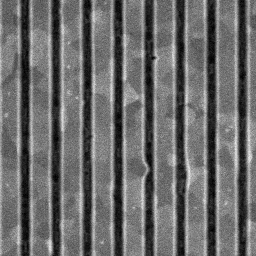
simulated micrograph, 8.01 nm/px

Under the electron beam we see parallel lines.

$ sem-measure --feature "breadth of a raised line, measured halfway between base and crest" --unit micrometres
0.167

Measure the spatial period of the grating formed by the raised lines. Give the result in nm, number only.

249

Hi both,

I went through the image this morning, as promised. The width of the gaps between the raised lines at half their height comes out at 84.1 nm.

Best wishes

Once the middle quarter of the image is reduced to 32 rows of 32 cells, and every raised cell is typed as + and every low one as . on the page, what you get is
++++...+++++...+++++...+++++..++
++++...+++++...+++++...+++++..++
++++...+++++...+++++...+++++..++
++++...+++++...+++++...+++++..++
++++...+++++...+++++...+++++..++
++++...+++++...+++++...+++++..++
++++...+++++...+++++...+++++..++
++++...+++++...+++++...+++++..++
++++...+++++...+++++...+++++..++
+++++..+++++...+++++...+++++..++
+++++..+++++...+++++...+++++..++
++++...+++++...+++++...+++++..++
++++...+++++...+++++...+++++..++
++++...+++++...+++++...+++++..++
++++...+++++...+++++...+++++..++
++++...+++++...+++++...+++++..++
++++...+++++...+++++...+++++..++
++++...+++++...+++++...+++++..++
++++...+++++...+++++...+++++..++
++++...+++++...+++++...+++++..++
++++...+++++...+++++...+++++..++
++++...+++++...+++++...+++++..++
++++...+++++...+++++...+++++..++
++++...+++++...+++++...+++++..++
++++...+++++...+++++...+++++...+
+++++..+++++...++++++..+++++...+
++++...+++++...++++++..+++++...+
++++...+++++...++++++..+++++...+
++++...+++++...+++++...+++++...+
++++...+++++...+++++...+++++...+
+++++..+++++...+++++...+++++...+
+++++..+++++...+++++...+++++...+